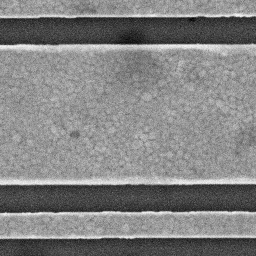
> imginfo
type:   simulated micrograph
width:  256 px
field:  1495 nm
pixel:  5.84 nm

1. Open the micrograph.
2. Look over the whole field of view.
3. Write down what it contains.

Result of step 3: lines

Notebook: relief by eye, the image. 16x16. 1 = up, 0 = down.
1111111111111111
0000000000000000
0000000000000000
1111111111111111
1111111111111111
1111111111111111
1111111111111111
1111111111111111
1111111111111111
1111111111111111
1111111111111111
0000000000000000
0000000000000000
1111111111111111
1111111111111111
0000000000000000